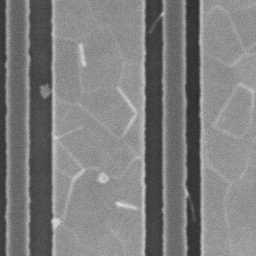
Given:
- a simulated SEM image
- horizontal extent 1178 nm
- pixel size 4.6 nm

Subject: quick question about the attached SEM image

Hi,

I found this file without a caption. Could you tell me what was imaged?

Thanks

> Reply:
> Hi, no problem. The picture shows lines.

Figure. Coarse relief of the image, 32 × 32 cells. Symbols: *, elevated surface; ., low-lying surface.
.***..************..***..*******
.***...***********..***..*******
.***..************..***..*******
.***...***********..***..*******
.***..************..***..*******
.***...***********..***..*******
.***...***********..***..*******
.***...***********..***..*******
.***..************..***..*******
.***...***********..***..*******
.***...***********..***..*******
.***...***********..***..*******
.***...***********..***..*******
.***...***********..***..*******
.***...***********..***..*******
.***...***********..***..*******
.***..************..***..*******
.***...***********..***..*******
.***...***********..***..*******
.***...***********..***..*******
.***...***********..***..*******
.***...***********..***..*******
.***...***********..***..*******
.***...***********..***..*******
.***...***********..***..*******
.***...***********..***..*******
.***...***********..***..*******
.***...***********..***..*******
.***...***********..***..*******
.***...***********..***..*******
.***...***********..***..*******
.***...***********..***..*******